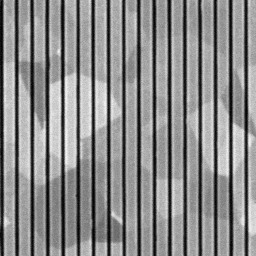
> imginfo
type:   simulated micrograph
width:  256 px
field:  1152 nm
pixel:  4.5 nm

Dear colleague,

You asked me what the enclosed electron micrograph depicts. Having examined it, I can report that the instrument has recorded parallel lines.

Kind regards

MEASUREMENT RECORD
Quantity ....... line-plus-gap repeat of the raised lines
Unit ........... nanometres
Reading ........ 68.8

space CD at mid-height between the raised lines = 21.9 nanometers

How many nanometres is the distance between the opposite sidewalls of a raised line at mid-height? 47.8